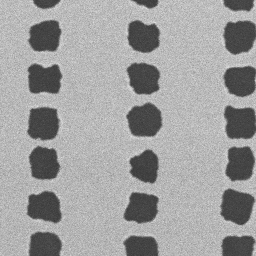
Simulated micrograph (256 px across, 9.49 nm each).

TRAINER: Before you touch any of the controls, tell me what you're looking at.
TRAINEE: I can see a regular array of holes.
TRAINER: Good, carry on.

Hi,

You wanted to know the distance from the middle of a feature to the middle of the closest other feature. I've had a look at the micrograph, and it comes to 398 nm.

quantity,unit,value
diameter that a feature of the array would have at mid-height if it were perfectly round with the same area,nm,315